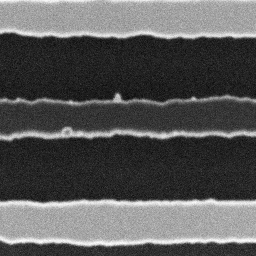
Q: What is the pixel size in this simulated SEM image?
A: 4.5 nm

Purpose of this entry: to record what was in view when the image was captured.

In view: lines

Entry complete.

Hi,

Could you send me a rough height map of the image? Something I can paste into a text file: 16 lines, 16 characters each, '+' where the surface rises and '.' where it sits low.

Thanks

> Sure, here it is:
++++++++++++++++
++++++++++++++++
................
................
................
................
++++++++++++++++
++++++++++++++++
+++++++..++.+.+.
................
................
................
................
++++++++++++++++
++++++++++++++++
................